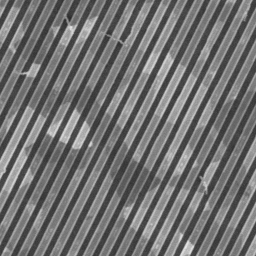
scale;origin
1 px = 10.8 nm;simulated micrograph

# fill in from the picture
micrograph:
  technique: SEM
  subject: parallel lines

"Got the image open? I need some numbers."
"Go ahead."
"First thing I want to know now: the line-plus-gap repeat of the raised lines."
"157 nm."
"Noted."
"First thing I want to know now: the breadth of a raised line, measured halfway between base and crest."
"76.1 nm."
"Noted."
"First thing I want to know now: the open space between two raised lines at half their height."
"84.6 nanometers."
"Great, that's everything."